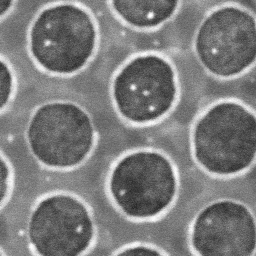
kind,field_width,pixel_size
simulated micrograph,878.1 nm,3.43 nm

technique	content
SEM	holes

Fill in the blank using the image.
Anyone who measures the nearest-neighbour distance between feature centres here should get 328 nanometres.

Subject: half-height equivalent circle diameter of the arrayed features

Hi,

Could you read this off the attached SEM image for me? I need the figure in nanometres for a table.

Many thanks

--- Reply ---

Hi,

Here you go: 225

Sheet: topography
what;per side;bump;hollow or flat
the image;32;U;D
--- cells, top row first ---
DUUUUUUUUUUUUUDDDDDDDDUUDUUUUUUU
DUUUUDDDDDDUUUUDDDDDDDUUUUUDDDDU
UUUUUDDDDDDUUUUUDDDDDUUUUUDDDDDD
UUUUDDDDDDDDUUUUUUUUUUUUUDDDDDDD
UUUUDDDDDDDDUUUUUUUUUUUUUDDDDDDD
UUUUDDDDDDDDUDDUUUUUUDDDDDDDDDDD
UUUUDDDDDDDUUDUUUUUUUUDDUDDDDDDD
UUUUUDDDDDDUUUUUUDDDDUUUUDDDDDDD
DUUUUUDDDDUUUUUUDDDDDUUUUUDDDDDU
DUUUUUUUUUUUUUUDDDDDDDUUUUUDDUUU
DDUUUUUUUUUUUUDDDDDDDDUUUUUUUUUU
DUUUUUUUUUUUUUDDDDDDDDUUUUUUUUUU
DUUUUUUUUUUUUUDDDDDDDDUUDUUUUUUU
UUUUUDDDDDUUUUUDDDDDDUUUUUDDDDDU
UUDUDDDDDDDUUUUUDDDDUUUUUUDDDDDD
UUDUDDDDDDDUUUUUUUUUUUUUUDDDDDDD
UUUDDDDDDDDDUUUUUUUUUUUUDDDDDDDD
UUUUDDDDDDDDUUUUUUUUUUUUDDDDDDDD
UUUUDDDDDDDUUUUUUUUUUUUUDDDDDDDD
UUUUDDDDDDDUUUUUDDDDUUUUDDDDDDDD
DUUUUDDDDDUUUUUDDDDDDUUUUDDDDDDU
DUUUUUUUUUUUUUDDDDDDDDUUUUDDDDUU
DUUUUUUUUUUUUUDDDDDDDDUUUUUUUUUU
DUUUUUUUUUUUUUDDDDDDDDUUUUUUUUUU
DUUUUUUDUUUUUUDDDDDDDDUUUUUUUUUU
UUUUUDDDDDUUUUUDDDDDDUUUUUDDDDUU
UUUUDDDDDDDUUUUUDDDDUUUUUDDDDDDU
UUUUDDDDDDDUUUUUUUUUUUUUDDDDDDDD
UUUUDDDDDDDDUUUUUUUUUUUUDDDDDDDD
UUUUDDDDDDDDUUUUUUUUUUUUDDDDDDDD
UUUUDDDDDDDUUUUUUUUUUUUUDDDDDDDD
UUUUUDDDDDUUUUUDDDDDUUUUUDDDDDDD